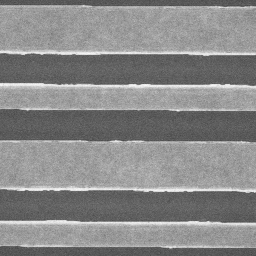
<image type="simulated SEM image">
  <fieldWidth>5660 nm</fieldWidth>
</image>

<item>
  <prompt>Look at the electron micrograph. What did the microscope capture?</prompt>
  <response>lines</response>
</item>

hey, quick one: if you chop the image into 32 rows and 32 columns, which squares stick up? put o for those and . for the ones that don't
................................
oooooooooooooooooooooooooooooooo
oooooooooooooooooooooooooooooooo
oooooooooooooooooooooooooooooooo
oooooooooooooooooooooooooooooooo
oooooooooooooooooooooooooooooooo
oooooooooooooooooooooooooooooooo
................................
................................
................................
................................
oooooooooooooooooooooooooooooooo
oooooooooooooooooooooooooooooooo
oooooooooooooooooooooooooooooooo
................................
................................
................................
................................
oooooooooooooooooooooooooooooooo
oooooooooooooooooooooooooooooooo
oooooooooooooooooooooooooooooooo
oooooooooooooooooooooooooooooooo
oooooooooooooooooooooooooooooooo
oooooooooooooooooooooooooooooooo
................................
................................
................................
................................
oooooooooooooooooooooooooooooooo
oooooooooooooooooooooooooooooooo
oooooooooooooooooooooooooooooooo
................................